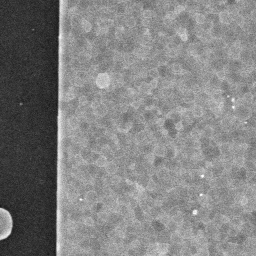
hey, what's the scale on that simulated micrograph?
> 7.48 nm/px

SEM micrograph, wiring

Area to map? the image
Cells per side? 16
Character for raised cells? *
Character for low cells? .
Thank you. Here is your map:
....************
....************
....************
....************
....************
....************
....************
....************
....************
....************
....************
....************
....************
*...************
*...************
....************